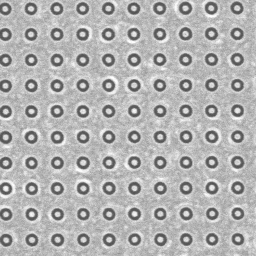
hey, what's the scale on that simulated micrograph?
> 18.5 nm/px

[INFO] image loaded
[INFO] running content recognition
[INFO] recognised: a regular array of ring-shaped grooves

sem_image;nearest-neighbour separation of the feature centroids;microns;0.47